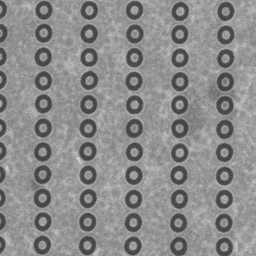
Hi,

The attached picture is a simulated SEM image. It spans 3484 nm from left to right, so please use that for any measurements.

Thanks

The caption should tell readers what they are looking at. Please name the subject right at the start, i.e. a regular array of ring-shaped grooves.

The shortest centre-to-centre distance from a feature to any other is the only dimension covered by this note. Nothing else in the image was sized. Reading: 317 nanometres